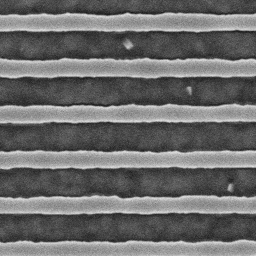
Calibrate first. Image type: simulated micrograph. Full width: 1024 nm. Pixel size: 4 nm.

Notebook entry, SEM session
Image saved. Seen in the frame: lines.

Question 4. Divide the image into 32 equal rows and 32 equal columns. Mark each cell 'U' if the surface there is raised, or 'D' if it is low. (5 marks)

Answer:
DDDDDDDDDDDDDDDDDDDDDDDDDDDDDDDD
DDDDDDDDDDDDDDDDDDDDDDDDDDDDDDDD
UUUUUUUUUUUUUUUUUUUUUUUUUUUUUUUU
UUUUUUUUUUUUUUUUUUUUUUUUUUUUUUUU
DDDDDDDDDDDDDDDDDDDDDDDDDDDDDDDD
DDDDDDDDDDDDDDDDDDDDDDDDDDDDDDDD
DDDDDDDDDDDDDDDDDDDDDDDDDDDDDDDD
UDDDDDDUUUDUUUUDDUUDDDUUUUDUDDDU
UUUUUUUUUUUUUUUUUUUUUUUUUUUUUUUU
UUUUUUUUUUUUUUUUUUUUUUUUUUUUUUUU
DDDDDDDDDDDDDDDDDDDDDDDDDDDDDDDD
DDDDDDDDDDDDDDDDDDDDDDDDDDDDDDDD
DDDDDDDDDDDDDDDDDDDDDDDDDDDDDDDD
UUUUUUUUUUUUUUUUUUUUUUUUUUUUUUUU
UUUUUUUUUUUUUUUUUUUUUUUUUUUUUUUU
DDDDDDDDDDDDDDDDDDDDDDDDDDDDDDDD
DDDDDDDDDDDDDDDDDDDDDDDDDDDDDDDD
DDDDDDDDDDDDDDDDDDDDDDDDDDDDDDDD
DDDDDDDDDDDDDDDDDDDDDDDDDDDDDDDD
UUUUUUUUUUUUUUUUUUUUUUUUUUUUUUUU
UUUUUUUUUUUUUUUUUUUUUUUUUUUUUUUU
DDDDDDDDDDDDDDDDDDDDDDDDDDDDDDDD
DDDDDDDDDDDDDDDDDDDDDDDDDDDDDDDD
DDDDDDDDDDDDDDDDDDDDDDDDDDDDDDDD
DDDDDDDDDDDDDDDDDDDDDDDDDDDDDDDD
UUUUUUUUUUUUUUUUUUUUUUUUUUUUUUUU
UUUUUUUUUUUUUUUUUUUUUUUUUUUUUUUU
DDDDDDDDDDDDDDDDDDDDDDDDDDDDDDDD
DDDDDDDDDDDDDDDDDDDDDDDDDDDDDDDD
DDDDDDDDDDDDDDDDDDDDDDDDDDDDDDDD
UUUUUUUUUUUUUUUUUUUUUUUUUUUUUUUU
UUUUUUUUUUUUUUUUUUUUUUUUUUUUUUUU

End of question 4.